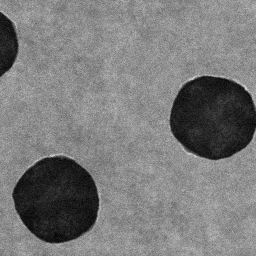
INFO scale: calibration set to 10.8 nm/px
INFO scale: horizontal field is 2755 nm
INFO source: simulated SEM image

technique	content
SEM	holes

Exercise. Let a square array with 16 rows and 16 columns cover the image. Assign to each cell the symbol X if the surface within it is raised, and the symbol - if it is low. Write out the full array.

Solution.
XXXXXXXXXXXXXXXX
-XXXXXXXXXXXXXXX
-XXXXXXXXXXXXXXX
-XXXXXXXXXXXXXXX
XXXXXXXXXXXXXXXX
XXXXXXXXXXX----X
XXXXXXXXXXX-----
XXXXXXXXXXX-----
XXXXXXXXXXX-----
XXXXXXXXXXXX---X
XX---XXXXXXXXXXX
X-----XXXXXXXXXX
X-----XXXXXXXXXX
X-----XXXXXXXXXX
XX---XXXXXXXXXXX
XXXXXXXXXXXXXXXX